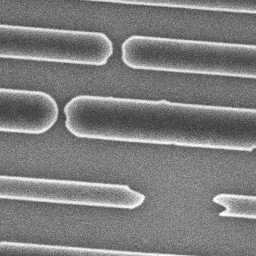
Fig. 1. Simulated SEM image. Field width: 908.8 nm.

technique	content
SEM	one or a few lines or trenches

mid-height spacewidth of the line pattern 138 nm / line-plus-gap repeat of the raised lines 254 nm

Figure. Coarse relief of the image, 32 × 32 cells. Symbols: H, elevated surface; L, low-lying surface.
LLLLLLLLLLLLLLLLLLHHHHHHHHHHHHHH
LLLLLLLLLLLLLLLLLLLLLLLLLLLLLLLH
LLLLLLLLLLLLLLLLLLLLLLLLLLLLLLLL
HHHHLLLLLLLLLLLLLLLLLLLLLLLLLLLL
HHHHHHHHHHHHHLLLLLLLLLLLLLLLLLLL
HHHHHHHHHHHHHHLLHHHHHHHHHHHHLLLL
HHHHHHHHHHHHHHLHHHHHHHHHHHHHHHHH
LLLLLLHHHHHHHLLLHHHHHHHHHHHHHHHH
LLLLLLLLLLLLLLLLLHHHHHHHHHHHHHHH
LLLLLLLLLLLLLLLLLLLLLLLLLLLLLLHH
LLLLLLLLLLLLLLLLLLLLLLLLLLLLLLLL
HHHHLLLLLLLLLLLLLLLLLLLLLLLLLLLL
HHHHHHHLLHHHHHHHLLLLLLLLLLLLLLLL
HHHHHHHLHHHHHHHHHHHHHHHHHHHHHLLL
HHHHHHHLHHHHHHHHHHHHHHHHHHHHHHHH
HHHHHHHLHHHHHHHHHHHHHHHHHHHHHHHH
LLLHHLLLLHHHHHHHHHHHHHHHHHHHHHHH
LLLLLLLLLLLLLLLLHHHHHHHHHHHHHHHH
LLLLLLLLLLLLLLLLLLLLLLLLLLLLHHHH
LLLLLLLLLLLLLLLLLLLLLLLLLLLLLLLL
LLLLLLLLLLLLLLLLLLLLLLLLLLLLLLLL
LLLLLLLLLLLLLLLLLLLLLLLLLLLLLLLL
HHHHHHLLLLLLLLLLLLLLLLLLLLLLLLLL
HHHHHHHHHHHHHHHHLLLLLLLLLLLLLLLL
HHHHHHHHHHHHHHHHHHLLLLLLLLLHHLLL
LLLLLLLLLLLHHHHHHLLLLLLLLLLLHHHH
LLLLLLLLLLLLLLLLLLLLLLLLLLLLHHHH
LLLLLLLLLLLLLLLLLLLLLLLLLLLLLLLL
LLLLLLLLLLLLLLLLLLLLLLLLLLLLLLLL
LLLLLLLLLLLLLLLLLLLLLLLLLLLLLLLL
HHLLLLLLLLLLLLLLLLLLLLLLLLLLLLLL
HHHHHHHHHHHHHHHLLLLLLLLLLLLLLLLL